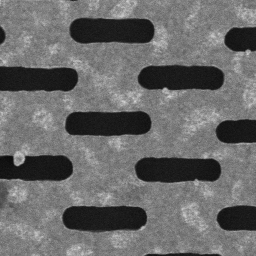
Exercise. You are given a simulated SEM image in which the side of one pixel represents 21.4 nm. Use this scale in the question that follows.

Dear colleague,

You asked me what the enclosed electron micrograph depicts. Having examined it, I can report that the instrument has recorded holes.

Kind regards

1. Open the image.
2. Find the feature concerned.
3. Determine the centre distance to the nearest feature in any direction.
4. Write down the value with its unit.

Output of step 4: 1790 nm